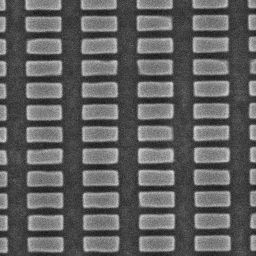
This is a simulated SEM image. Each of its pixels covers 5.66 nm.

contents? groups of lines, slits or small figures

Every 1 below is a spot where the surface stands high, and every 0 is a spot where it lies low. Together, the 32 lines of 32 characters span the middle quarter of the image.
00000111111110000001111111100000
00000111111110000001111111100000
00000110000000000000000000000000
00000000000000000000000000000000
00000000000000000000000000000000
00000111111110000001111111100000
00000111111110000001111111100000
00000111111110000001111111100000
00000000000000000000000000000000
00000000000000000000000000000000
00000001111110000001111111100000
00000111111110000001111111100000
00000111111110000001111111100000
00000110000010000001110000000000
00000000000000000000000000000000
00000000000000000000000000000000
00000111111110000001111111100000
00000111111110000001111111100000
00000111111110000001111111100000
00000000000000000000000000000000
00000000000000000000000000000000
00000111111110000001110000100000
00000111111110000001111111100000
00000111111110000001111111100000
00000111111110000001111100000000
00000000000000000000000000000000
00000000000000000000000000000000
00000111111110000001111111100000
00000111111110000001111111100000
00000111111111000001111111100000
00000000000000000000000000000000
00000000000000000000000000000000